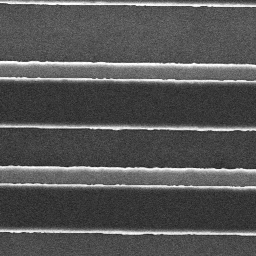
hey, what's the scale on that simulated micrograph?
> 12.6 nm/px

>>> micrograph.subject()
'lines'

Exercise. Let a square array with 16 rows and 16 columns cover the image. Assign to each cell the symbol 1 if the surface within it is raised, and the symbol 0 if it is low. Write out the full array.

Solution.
0000000000000000
0000000000000000
0000000000000000
0000000000000000
1111111111111111
1111111111111111
1111111111111111
1111111111111111
0000000000000000
0000000000000000
1111111100000000
1111111111111111
1111111111111111
1111111111111111
0000111111111111
0000000000000000